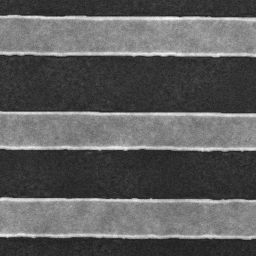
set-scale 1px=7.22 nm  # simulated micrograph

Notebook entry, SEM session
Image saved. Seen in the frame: lines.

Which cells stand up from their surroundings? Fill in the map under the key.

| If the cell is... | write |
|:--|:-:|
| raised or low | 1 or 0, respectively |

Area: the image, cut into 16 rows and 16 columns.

0000000000000000
1111111111111111
1111111111111111
0000000000000000
0000000000000000
0000000000000000
0000000000000000
1111111111111111
1111111111111111
0000000000000000
0000000000000000
0000000000000000
1111111111111111
1111111111111111
1111111111111111
0000000000000000